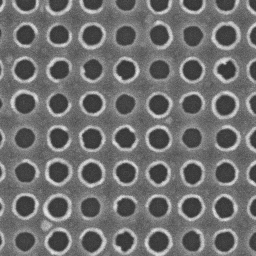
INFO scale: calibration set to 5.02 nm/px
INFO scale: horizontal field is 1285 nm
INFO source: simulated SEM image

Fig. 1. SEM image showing a regular array of holes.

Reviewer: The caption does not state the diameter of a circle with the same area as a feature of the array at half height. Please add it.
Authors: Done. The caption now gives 99.6 nm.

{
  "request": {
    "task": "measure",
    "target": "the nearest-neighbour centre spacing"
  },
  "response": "0.166 micrometres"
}